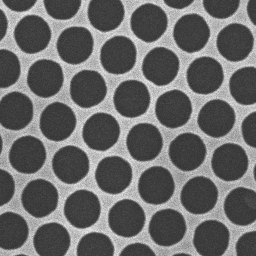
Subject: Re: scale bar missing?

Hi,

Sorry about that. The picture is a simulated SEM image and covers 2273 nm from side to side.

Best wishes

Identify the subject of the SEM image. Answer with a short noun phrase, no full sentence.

a regular array of holes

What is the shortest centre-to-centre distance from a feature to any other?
43.9 pixels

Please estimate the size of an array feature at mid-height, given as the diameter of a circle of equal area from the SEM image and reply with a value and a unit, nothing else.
335 nanometers